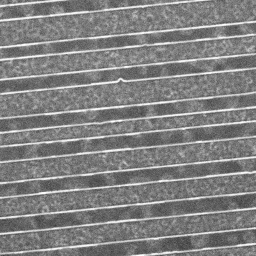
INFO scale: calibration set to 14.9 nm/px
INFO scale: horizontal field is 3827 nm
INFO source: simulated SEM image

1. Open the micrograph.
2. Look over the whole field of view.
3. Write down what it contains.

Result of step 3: parallel lines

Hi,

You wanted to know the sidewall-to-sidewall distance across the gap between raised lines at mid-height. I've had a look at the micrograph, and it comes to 298 nm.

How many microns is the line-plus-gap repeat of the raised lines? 0.517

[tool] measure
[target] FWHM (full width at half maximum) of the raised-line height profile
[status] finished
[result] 14.8 pixels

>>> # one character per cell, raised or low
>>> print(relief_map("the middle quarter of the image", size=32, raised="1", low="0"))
00000000000000000011111111111111
00000000111111111111111111111111
11111111111111111111111111111111
11111111111111111111111100000000
11111111111110000000000000000000
11110000000000000000000000000000
00000000000000000000000000000000
00000000000000000000000000000000
00000000000000000000000000000000
00000000000000000000000001111111
00000000000000011111111111111111
00000111111111111111111111111111
11111111111111111111111111111111
11111111111111111111000000000000
11111111110000000000000000000000
00000000000000000000000000000000
00000000000000000000000000111111
00000000000000001111111111111111
00000011111111111111111111111111
11111111111111111111111111111111
11111111111111111111111100000000
11111111111111000000000000000000
11111000000000000000000000000000
00000000000000000000000000000000
00000000000000000000000000000000
00000000000000000000000000111111
00000000000000001111111111111111
00000011111111111111111111111111
11111111111111111111111111111111
11111111111111111111111000000000
11111111111111000000000000000000
11100000000000000000000000000000